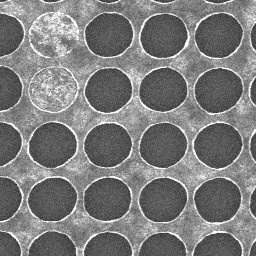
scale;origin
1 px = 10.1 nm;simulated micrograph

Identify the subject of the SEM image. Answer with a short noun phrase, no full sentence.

a regular array of holes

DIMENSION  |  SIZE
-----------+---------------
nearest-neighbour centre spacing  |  54.5 px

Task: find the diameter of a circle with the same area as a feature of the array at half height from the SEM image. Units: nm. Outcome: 470